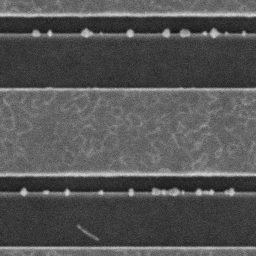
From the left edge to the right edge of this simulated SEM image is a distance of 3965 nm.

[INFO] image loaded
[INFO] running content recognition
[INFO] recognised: lines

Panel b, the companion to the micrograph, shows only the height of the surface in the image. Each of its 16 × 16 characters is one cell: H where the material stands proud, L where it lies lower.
HHHHHHHHHHHHHHHH
LLLLLLLLLLLLLLLL
LLLLLLLLLLLLLLLL
LLLLLLLLLLLLLLLL
LLLLLLLLLLLLLLLL
LLHHLLLLLLLLLLLL
HHHHHHHHHHHHHHHH
HHHHHHHHHHHHHHHH
HHHHHHHHHHHHHHHH
HHHHHHHHHHHHHHHH
HHHHHHHHHHHHHHHH
LLLLLLLLLLLLLLLL
LLLLLLLLLLLLLLLL
LLLLLLLLLLLLLLLL
LLLLLLLLLLLLLLLL
HHHHHHHHHHHHHHHH